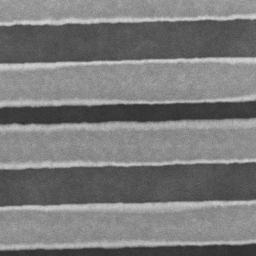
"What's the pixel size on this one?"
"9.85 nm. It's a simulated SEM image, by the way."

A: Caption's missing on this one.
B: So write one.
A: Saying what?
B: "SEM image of lines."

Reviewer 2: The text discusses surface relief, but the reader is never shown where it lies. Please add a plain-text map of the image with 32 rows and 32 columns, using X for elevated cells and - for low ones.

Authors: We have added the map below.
XXXXXXXXXXXXXXXXXXXXXXXXXXXXXXXX
XXXXXXXXXXXXXXXXXXXXXXXXXXXXXXXX
XXXXXXXXXXXXXXXXXXXXXXXXX-------
--------------------------------
--------------------------------
--------------------------------
--------------------------------
------------------XXXXXXXXXXXXXX
XXXXXXXXXXXXXXXXXXXXXXXXXXXXXXXX
XXXXXXXXXXXXXXXXXXXXXXXXXXXXXXXX
XXXXXXXXXXXXXXXXXXXXXXXXXXXXXXXX
XXXXXXXXXXXXXXXXXXXXXXXXXXXXXXXX
XXXXXXXXXXXXXXXXXXXXXXXXXXXXXXX-
--------------------------------
--------------------------------
----------X-XXXXXXXXXXXXXXXXXXXX
XXXXXXXXXXXXXXXXXXXXXXXXXXXXXXXX
XXXXXXXXXXXXXXXXXXXXXXXXXXXXXXXX
XXXXXXXXXXXXXXXXXXXXXXXXXXXXXXXX
XXXXXXXXXXXXXXXXXXXXXXXXXXXXXXXX
XXXXXXXXXXXXXXXXXXXXX-----------
--------------------------------
--------------------------------
--------------------------------
--------------------------------
-------------------XXXXXXXXXXXXX
XXXXXXXXXXXXXXXXXXXXXXXXXXXXXXXX
XXXXXXXXXXXXXXXXXXXXXXXXXXXXXXXX
XXXXXXXXXXXXXXXXXXXXXXXXXXXXXXXX
XXXXXXXXXXXXXXXXXXXXXXXXXXXXXXXX
XXXXXXXXXXXXXXXXXXXXXXXXXXXXXXX-
--------------------------------